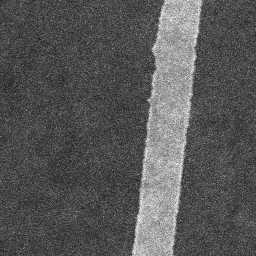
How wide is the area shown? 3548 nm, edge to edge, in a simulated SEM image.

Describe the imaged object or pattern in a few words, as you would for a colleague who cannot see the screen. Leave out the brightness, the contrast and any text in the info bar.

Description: one or a few lines or trenches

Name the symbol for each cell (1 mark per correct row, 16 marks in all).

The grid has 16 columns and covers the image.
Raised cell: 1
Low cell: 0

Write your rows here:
0000000000111000
0000000000110000
0000000000110000
0000000000110000
0000000000110000
0000000000110000
0000000001110000
0000000001110000
0000000001110000
0000000001100000
0000000001100000
0000000001100000
0000000001100000
0000000001100000
0000000001100000
0000000011100000